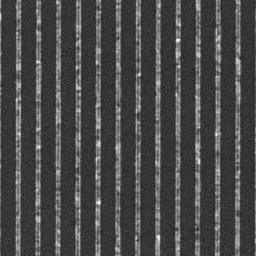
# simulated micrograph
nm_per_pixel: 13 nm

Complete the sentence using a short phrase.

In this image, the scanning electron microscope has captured parallel lines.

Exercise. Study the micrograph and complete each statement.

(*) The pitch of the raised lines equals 259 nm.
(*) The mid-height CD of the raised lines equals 0.0439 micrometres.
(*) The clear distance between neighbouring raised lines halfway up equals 216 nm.